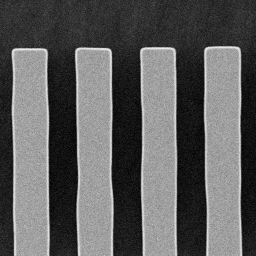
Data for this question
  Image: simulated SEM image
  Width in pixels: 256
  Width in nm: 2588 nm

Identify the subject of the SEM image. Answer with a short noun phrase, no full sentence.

groups of lines, slits or small figures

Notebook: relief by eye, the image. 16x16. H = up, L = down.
LLLLLLLLLLLLLLLL
LLLLLLLLLLLLLLLL
LLLLLLLLLLLLLLLL
LHHLLHHLLHHLLHHL
LHHLLHHLLHHLLHHL
LHHLLHHLLHHLLHHL
LHHLLHHLLHHLLHHL
LHHLLHHLLHHLLHHL
LHHLLHHLLHHLLHHL
LHHLLHHLLHHLLHHL
LHHLLHHLLHHLLHHL
LHHLLHHLLHHLLHHL
LHHLLHHLLHHLLHHL
LHHLLHHLLHHLLHHL
LHHLLHHLLHHLLHHL
LHHLLHHLLHHLLHHL